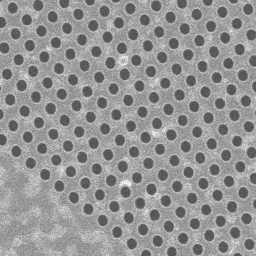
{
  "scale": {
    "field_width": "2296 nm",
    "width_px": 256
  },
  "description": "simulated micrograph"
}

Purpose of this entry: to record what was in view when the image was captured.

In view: a regular array of holes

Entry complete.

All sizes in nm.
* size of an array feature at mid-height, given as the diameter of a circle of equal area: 98.1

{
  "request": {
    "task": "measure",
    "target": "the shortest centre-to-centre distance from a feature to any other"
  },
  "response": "162 nanometres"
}